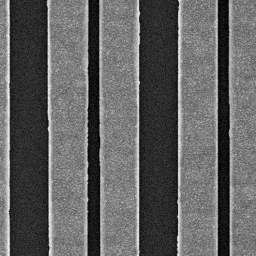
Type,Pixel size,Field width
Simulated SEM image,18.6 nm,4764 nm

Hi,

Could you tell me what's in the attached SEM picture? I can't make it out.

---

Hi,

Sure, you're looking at lines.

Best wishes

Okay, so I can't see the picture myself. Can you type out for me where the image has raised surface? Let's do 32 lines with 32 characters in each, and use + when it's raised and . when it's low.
+.....+++++.+++++.....+++++..+++
+.....+++++.+++++.....+++++..+++
+.....+++++.+++++.....+++++..+++
+.....+++++.+++++.....+++++..+++
+.....+++++.+++++.....+++++..+++
+.....+++++.+++++.....+++++..+++
+.....+++++.+++++.....+++++..+++
+.....+++++.+++++.....+++++..+++
+.....+++++.+++++.....+++++..+++
+.....+++++.+++++.....+++++..+++
+.....+++++.+++++.....+++++..+++
+.....+++++..++++.....+++++..+++
+.....+++++..++++.....+++++..+++
+.....+++++..++++.....+++++..+++
+.....+++++..++++.....+++++..+++
+.....+++++..++++.....+++++..+++
+.....+++++..++++.....+++++..+++
+.....+++++..++++.....+++++..+++
+.....+++++..++++.....+++++..+++
+.....+++++..++++.....+++++..+++
+.....+++++..++++.....+++++..+++
+.....+++++..++++.....+++++..+++
+.....+++++..++++.....+++++..+++
+.....+++++..++++.....+++++..+++
+.....+++++..++++.....+++++..+++
+.....+++++..++++.....+++++..+++
+.....+++++..++++.....+++++..+++
+.....+++++..++++.....+++++..+++
+.....+++++..++++.....+++++..+++
+.....+++++..++++.....+++++..+++
+.....+++++..++++.....+++++..+++
+.....+++++..++++.....+++++..+++